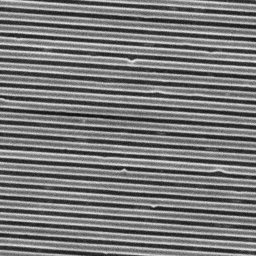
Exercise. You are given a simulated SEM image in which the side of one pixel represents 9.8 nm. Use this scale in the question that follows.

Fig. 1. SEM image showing parallel lines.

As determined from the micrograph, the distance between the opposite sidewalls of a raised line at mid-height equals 68.4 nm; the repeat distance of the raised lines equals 123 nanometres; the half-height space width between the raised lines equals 51.3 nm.